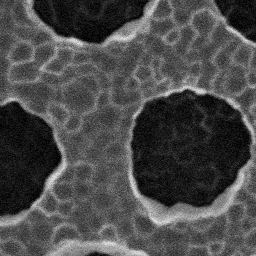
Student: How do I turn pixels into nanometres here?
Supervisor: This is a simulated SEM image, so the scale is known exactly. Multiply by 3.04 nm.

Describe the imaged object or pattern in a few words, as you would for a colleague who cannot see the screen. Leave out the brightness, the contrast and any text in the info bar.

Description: holes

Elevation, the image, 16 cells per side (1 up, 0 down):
1100000001111100
1110000011111100
1111100111111111
1111111111111111
1111111111111111
1111111111111111
0111111110000011
0001111100000001
0001111100000000
0000111100000000
0000111100000001
0001111100000001
0011111110000011
0111111111111111
1111111111111111
1111111111111111